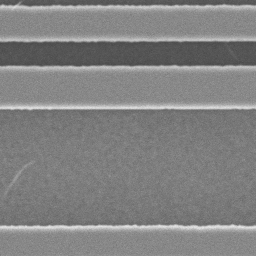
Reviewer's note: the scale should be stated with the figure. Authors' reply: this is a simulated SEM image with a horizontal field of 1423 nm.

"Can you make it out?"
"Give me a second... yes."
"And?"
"lines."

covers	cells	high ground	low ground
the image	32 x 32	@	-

--------------------------------
@@@@@@@@@@@@@@@@@@@@@@@@@@@@@@@@
@@@@@@@@@@@@@@@@@@@@@@@@@@@@@@@@
@@@@@@@@@@@@@@@@@@@@@@@@@@@@@@@@
@@@@@@@@@@@@@@@@@@@@@@@@@@@@@@@@
--------------------------------
--------------------------------
--------------------------------
@@@@@@@@@@@@@@@@@@@@@@@@@@@@@@@@
@@@@@@@@@@@@@@@@@@@@@@@@@@@@@@@@
@@@@@@@@@@@@@@@@@@@@@@@@@@@@@@@@
@@@@@@@@@@@@@@@@@@@@@@@@@@@@@@@@
@@@@@@@@@@@@@@@@@@@@@@@@@@@@@@@@
@@@@@@@@@@@@@@@@@@@@@@@@@@@@@@@@
--------------------------------
--------------------------------
--------------------------------
--------------------------------
--------------------------------
--------------------------------
--------------------------------
--------------------------------
--------------------------------
--------------------------------
--------------------------------
--------------------------------
--------------------------------
--------------------------------
@@@@@@@@@@@@@@@@@@@@@@@@@@@@@@@@
@@@@@@@@@@@@@@@@@@@@@@@@@@@@@@@@
@@@@@@@@@@@@@@@@@@@@@@@@@@@@@@@@
@@@@@@@@@@@@@@@@@@@@@@@@@@@@@@@@